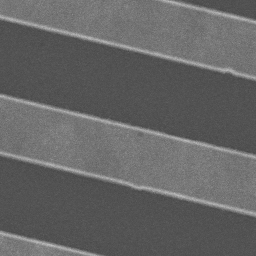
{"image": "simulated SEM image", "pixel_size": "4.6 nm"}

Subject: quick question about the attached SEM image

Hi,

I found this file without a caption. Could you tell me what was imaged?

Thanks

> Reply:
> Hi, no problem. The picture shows one or a few lines or trenches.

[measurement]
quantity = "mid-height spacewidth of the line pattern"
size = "355 nanometers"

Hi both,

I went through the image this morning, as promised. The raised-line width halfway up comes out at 254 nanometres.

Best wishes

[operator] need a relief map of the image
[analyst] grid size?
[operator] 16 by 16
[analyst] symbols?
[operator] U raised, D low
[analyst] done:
UUUUUUUUUUUUDDDD
DDUUUUUUUUUUUUUU
DDDDDDUUUUUUUUUU
DDDDDDDDDDUUUUUU
DDDDDDDDDDDDDDUU
DDDDDDDDDDDDDDDD
UUDDDDDDDDDDDDDD
UUUUUUDDDDDDDDDD
UUUUUUUUUUDDDDDD
UUUUUUUUUUUUUUUD
DDDDUUUUUUUUUUUU
DDDDDDDDUUUUUUUU
DDDDDDDDDDDDUUUU
DDDDDDDDDDDDDDDD
DDDDDDDDDDDDDDDD
UUUUDDDDDDDDDDDD